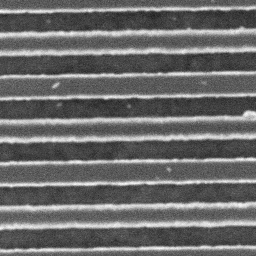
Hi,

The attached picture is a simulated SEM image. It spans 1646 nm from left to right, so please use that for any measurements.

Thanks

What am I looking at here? lines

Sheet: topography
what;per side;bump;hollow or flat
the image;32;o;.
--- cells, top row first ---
oooooooooooooooooooooooooooooooo
ooooooo.........................
................................
................................
oooooooooooooooooooooooooooooooo
oooooooooooooooooooooooooooooooo
oooooooooooooooo.o....o.........
................................
................................
.......ooooooooooooooooooooooooo
oooooooooooooooooooooooooooooooo
oooooooooooooooooooooooooooooooo
................................
................................
..............................oo
oooooooooooooooooooooooooooooooo
oooooooooooooooooooooooooooooooo
oooooooo.o......................
................................
................................
oooooooooooooooooooooooooooooooo
oooooooooooooooooooooooooooooooo
oooooooooooooooooooooooooooooooo
................................
................................
...............................o
oooooooooooooooooooooooooooooooo
oooooooooooooooooooooooooooooooo
................................
................................
................................
oooooooooooooooooooooooooooooooo